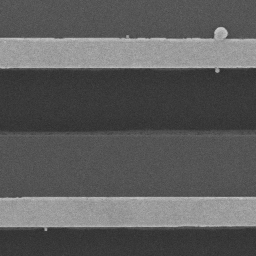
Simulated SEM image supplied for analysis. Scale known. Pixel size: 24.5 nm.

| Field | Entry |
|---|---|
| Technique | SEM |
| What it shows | lines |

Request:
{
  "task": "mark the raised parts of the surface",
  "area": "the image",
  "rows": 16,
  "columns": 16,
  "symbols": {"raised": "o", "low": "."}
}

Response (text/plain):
oooooooooooooooo
oooooooooooooooo
oooooooooooooooo
oooooooooooooooo
................
................
................
................
oooooooooooooooo
oooooooooooooooo
oooooooooooooooo
oooooooooooooooo
oooooooooooooooo
oooooooooooooooo
................
................